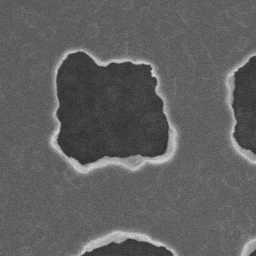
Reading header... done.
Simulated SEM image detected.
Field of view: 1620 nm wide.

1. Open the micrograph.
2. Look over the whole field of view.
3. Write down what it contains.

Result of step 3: holes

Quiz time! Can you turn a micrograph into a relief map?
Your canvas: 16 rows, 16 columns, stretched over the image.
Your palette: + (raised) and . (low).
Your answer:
++++++++++++++++
++++++++++++++++
++++++++++++++++
++++..++++++++++
++++.....++++++.
++++......++++..
++++......++++..
++++......+++++.
++++.......++++.
++++.......++++.
++++++++++++++++
++++++++++++++++
++++++++++++++++
++++++++++++++++
++++++++++++++++
++++++....++++++